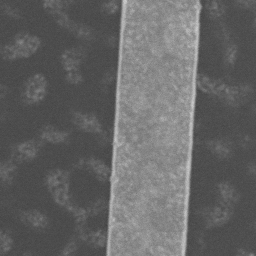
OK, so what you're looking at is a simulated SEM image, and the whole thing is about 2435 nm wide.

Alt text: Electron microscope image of one or a few lines or trenches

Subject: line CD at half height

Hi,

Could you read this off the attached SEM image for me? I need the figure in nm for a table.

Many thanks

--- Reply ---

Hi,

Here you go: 715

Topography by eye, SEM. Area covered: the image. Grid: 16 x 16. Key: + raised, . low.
........++++....
........++++....
........++++....
........++++....
.......+++++....
.......+++++....
.......+++++....
.......+++++....
.......+++++....
.......+++++....
.......+++++....
.......+++++....
.......+++++....
.......+++++....
.......+++++....
.......+++++....